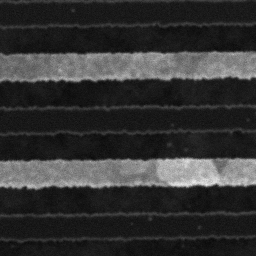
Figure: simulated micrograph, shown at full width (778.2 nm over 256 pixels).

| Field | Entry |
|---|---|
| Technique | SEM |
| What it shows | lines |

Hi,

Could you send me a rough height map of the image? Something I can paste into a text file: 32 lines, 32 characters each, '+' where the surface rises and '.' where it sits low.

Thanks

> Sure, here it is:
++++++++++++++++++++++++++++++++
++++++++++++++++++++++++++++++++
++++++++++++++++++++++++++++++++
+...............................
................................
................................
..............................++
++++++++++++++++++++++++++++++++
++++++++++++++++++++++++++++++++
++++++++++++++++++++++++++++.+++
................................
................................
................................
++++++++++.+++++++++++++++++++++
++++++++++++++++++++++++++++++++
++++++++++++++++++++++++++++++++
+++++++++++++++++++++++.++....++
................................
................................
................................
++++++++++++++++++++++++++++++++
++++++++++++++++++++++++++++++++
++++++++++++++++++++++++++++++++
................................
................................
................................
...........................+...+
++++++++++++++++++++++++++++++++
++++++++++++++++++++++++++++++++
++++++++++++++++++++++++++++++++
................................
................................